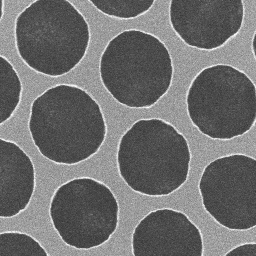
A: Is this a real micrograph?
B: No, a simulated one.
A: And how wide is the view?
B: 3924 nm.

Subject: holes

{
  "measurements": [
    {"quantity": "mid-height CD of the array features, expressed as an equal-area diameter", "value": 1140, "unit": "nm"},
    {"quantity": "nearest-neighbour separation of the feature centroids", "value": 1360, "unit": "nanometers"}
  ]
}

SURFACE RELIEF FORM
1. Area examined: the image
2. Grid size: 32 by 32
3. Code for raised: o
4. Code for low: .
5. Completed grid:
oooo.....ooo.......oo.........oo
ooo.......ooo.....ooo.........oo
oo.........oooooooooo.........oo
oo.........ooooooooooo........oo
oo.........oooo....oooo......ooo
oo.........ooo......ooo.....oooo
oo.........oo........ooooooooooo
.oo.......ooo........ooooooooooo
..oo.....oooo.........oooo...ooo
..ooooooooooo........oooo......o
...oooooooooo........ooo........
...ooo.....ooo.......ooo........
..oo........ooo.....ooo.........
..oo........oooooooooooo........
.ooo.........ooooooooooo........
oooo.........oooo....ooo........
oooo.........ooo......ooo......o
oooo.........oo........ooooooooo
..ooo.......ooo.........oooooooo
...ooo.....oooo.........ooooo..o
....ooooooooooo.........oo......
....ooooooooooo........oo.......
....ooooo...oooo.......oo.......
....ooo......ooo......ooo.......
....ooo.......ooooooooooo.......
...ooo.........oooooooooo.......
..oooo.........oooo...oooo......
ooooooo........ooo......ooo.....
ooooooo.......ooo........oooo..o
....oooo......ooo........ooooooo
.....ooo.....oooo........oooooo.
......ooooooooooo........oooo...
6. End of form